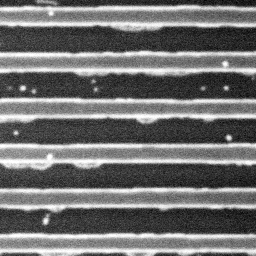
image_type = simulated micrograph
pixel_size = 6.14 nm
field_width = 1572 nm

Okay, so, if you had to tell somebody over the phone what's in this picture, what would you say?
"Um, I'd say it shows lines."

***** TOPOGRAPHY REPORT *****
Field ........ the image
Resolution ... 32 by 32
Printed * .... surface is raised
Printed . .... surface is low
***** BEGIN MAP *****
................................
********************************
********************************
................................
................................
................................
................................
********************************
********************************
................................
................................
................................
**********......................
********************************
********************************
................................
................................
................................
********************************
********************************
................................
................................
................................
................................
********************************
********************************
................................
................................
................................
*********.**********************
********************************
................................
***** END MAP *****